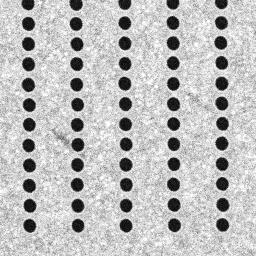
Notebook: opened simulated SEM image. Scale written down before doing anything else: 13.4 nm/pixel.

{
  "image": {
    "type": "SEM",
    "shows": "a regular array of holes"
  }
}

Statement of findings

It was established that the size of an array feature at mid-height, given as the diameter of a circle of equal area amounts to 182 nm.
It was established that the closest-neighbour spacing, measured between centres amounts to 267 nanometers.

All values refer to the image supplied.